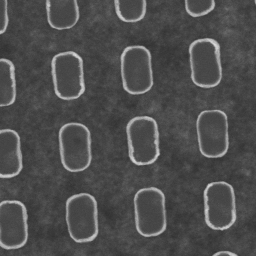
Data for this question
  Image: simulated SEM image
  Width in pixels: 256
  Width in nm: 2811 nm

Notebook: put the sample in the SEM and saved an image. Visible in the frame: a regular array of raised bodies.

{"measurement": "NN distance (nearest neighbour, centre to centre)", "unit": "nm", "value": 758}